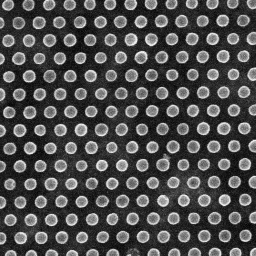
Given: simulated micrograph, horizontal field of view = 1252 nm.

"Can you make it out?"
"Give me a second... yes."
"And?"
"a regular array of raised bodies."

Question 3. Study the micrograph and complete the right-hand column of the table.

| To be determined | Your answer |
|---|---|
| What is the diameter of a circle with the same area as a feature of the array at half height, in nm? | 54.9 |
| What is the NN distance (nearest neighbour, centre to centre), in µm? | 0.0986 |